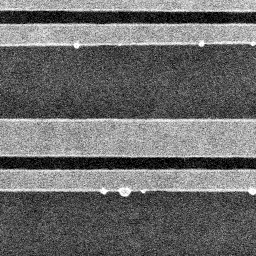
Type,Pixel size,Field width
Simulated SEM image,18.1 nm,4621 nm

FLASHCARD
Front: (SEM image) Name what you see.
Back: lines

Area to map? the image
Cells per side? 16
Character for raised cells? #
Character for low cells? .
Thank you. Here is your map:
################
################
################
................
................
................
................
####.###........
################
################
################
################
................
................
................
................